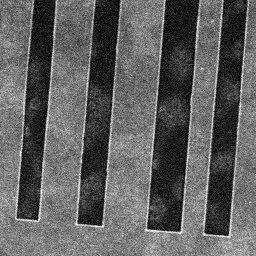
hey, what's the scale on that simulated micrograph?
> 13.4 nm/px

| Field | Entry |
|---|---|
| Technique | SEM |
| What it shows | one or a few lines or trenches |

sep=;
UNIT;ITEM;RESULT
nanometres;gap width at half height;351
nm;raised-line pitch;907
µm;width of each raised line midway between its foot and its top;0.505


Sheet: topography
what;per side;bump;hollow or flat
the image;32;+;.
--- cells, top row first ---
++++...+++++...++++++....+++...+
++++...+++++...++++++....+++...+
++++...+++++...+++++.....+++...+
++++...++++....+++++.....+++...+
++++...++++....+++++.....+++...+
++++...++++....+++++.....++....+
++++...++++....+++++....+++....+
++++...++++....+++++....+++...++
+++...+++++...++++++....+++...++
+++...+++++...++++++....+++...++
+++...+++++...++++++....+++...++
+++...+++++...++++++....+++...++
+++...+++++...++++++....+++...++
+++...+++++...+++++.....+++...++
+++...+++++...+++++.....+++...++
+++...+++++...+++++.....+++...++
+++...++++....+++++.....++....++
+++...++++....+++++.....++....++
+++...++++....+++++.....++....++
+++...++++....+++++....+++....++
+++..+++++...++++++....+++...+++
++...+++++...++++++....+++...+++
++...+++++...++++++....+++...+++
++...+++++...++++++....+++...+++
++...+++++...++++++....+++...+++
++...+++++...+++++.....+++...+++
++...+++++...+++++.....+++...+++
+++.++++++...+++++.....+++...+++
++++++++++++++++++.....++....+++
+++++++++++++++++++++++++++.++++
++++++++++++++++++++++++++++++++
++++++++++++++++++++++++++++++++